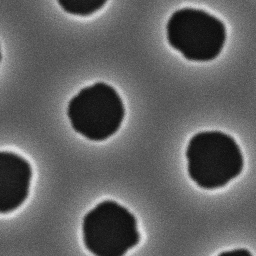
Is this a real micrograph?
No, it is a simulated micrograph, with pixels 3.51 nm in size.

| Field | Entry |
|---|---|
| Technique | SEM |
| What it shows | holes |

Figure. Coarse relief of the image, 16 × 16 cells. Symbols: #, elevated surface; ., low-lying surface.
####..##########
##########....##
##########....##
###########...##
################
#####..#########
####....########
####....########
#####..#####..##
.###########...#
..##########...#
..##########..##
..##############
#####...########
#####....#######
#####...########